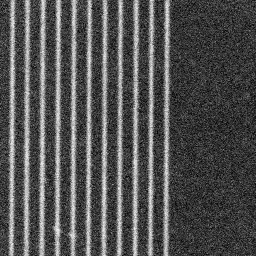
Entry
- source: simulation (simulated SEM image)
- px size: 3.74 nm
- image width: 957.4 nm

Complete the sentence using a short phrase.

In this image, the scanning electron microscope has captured parallel lines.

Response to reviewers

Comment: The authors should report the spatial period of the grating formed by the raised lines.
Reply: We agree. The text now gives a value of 15.5 px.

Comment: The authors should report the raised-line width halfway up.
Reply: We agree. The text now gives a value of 10.8 nm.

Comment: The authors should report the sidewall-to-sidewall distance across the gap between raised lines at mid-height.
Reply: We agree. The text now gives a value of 47.7 nm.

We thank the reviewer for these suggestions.